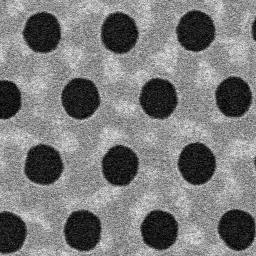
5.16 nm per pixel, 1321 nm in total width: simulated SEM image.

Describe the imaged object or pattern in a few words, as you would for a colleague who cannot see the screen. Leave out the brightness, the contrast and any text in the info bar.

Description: a regular array of holes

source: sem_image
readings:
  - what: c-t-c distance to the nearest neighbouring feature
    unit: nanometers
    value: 390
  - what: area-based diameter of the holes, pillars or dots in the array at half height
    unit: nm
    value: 207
